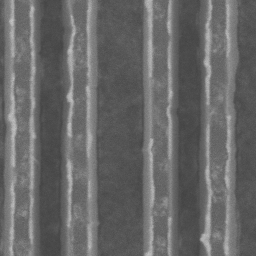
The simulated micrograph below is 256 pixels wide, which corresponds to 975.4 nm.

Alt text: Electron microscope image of one or a few lines or trenches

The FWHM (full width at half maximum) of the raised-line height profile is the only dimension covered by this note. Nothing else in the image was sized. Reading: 106 nm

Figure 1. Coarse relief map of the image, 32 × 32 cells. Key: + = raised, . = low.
.+++....++++......++++....+++...
.+++....++++......++++....+++...
.+++....++++......++++....+++...
.+++.....++.......++++....+++...
.+++....+++.......++++...++++...
.++++...++++......++++....+++...
.++++...++++......++++....+++...
.++++...++++......++++....+++...
.++++...++++......++++....+++...
.++++...++++......++++....+++...
.++++...++++......++++....+++...
.++++...++++......++++....+++...
.++++...+++.......++++...++++...
.++++...+++.......++++...++++...
.+++....++++......++++....+++...
.++++...++++.......+++...++++...
.++++...++++.......+++...++++...
.++++...++++.......+++...++++...
.++++...++++......++++...++++...
.++++...++++......++++....+++...
.++++...++++......++++....+++...
.++++...++++......++++....+++...
.++++...++++......++++....+++...
.+++....++++......++++....+++...
.+++....++++......++++....+++...
.+++....++++......++++....+++...
.+++....++++......++++...++++...
.+++....++++......++++...++++...
.+++....++++......++++...++++...
.+++....++++......++++...++++...
.+++....++++......++++...++++...
.+++....++++......++++....+++...